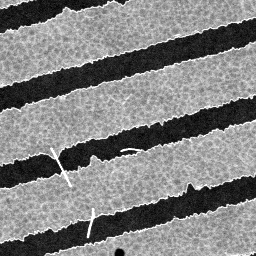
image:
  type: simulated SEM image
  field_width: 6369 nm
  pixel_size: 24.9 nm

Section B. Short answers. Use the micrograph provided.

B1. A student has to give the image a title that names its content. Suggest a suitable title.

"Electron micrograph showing one or a few lines or trenches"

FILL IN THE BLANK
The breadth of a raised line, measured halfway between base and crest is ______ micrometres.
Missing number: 0.614